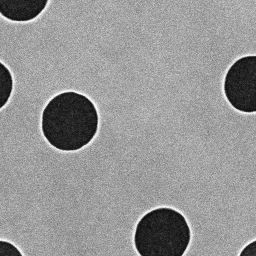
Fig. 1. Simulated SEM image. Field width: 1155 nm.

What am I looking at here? holes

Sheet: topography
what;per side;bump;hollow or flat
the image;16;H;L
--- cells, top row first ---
LLLHHHHHHHHHHHHH
HHHHHHHHHHHHHHHH
HHHHHHHHHHHHHHHH
HHHHHHHHHHHHHHHH
LHHHHHHHHHHHHHLL
LHHHHHHHHHHHHHLL
HHHLLLHHHHHHHHHL
HHHLLLHHHHHHHHHH
HHHLLLHHHHHHHHHH
HHHHHHHHHHHHHHHH
HHHHHHHHHHHHHHHH
HHHHHHHHHHHHHHHH
HHHHHHHHHHHHHHHH
HHHHHHHHHLLHHHHH
HHHHHHHHLLLLHHHH
LHHHHHHHHLLLHHHL